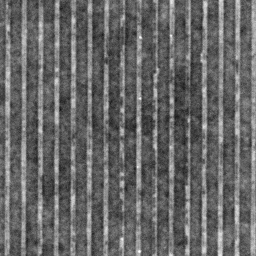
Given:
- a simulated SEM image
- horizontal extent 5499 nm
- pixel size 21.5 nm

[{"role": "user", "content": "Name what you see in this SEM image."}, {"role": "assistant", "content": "parallel lines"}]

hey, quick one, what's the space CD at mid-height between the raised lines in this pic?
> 282 nanometres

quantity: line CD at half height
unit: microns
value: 0.0617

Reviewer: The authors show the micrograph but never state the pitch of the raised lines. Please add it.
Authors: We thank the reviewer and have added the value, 352 nm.